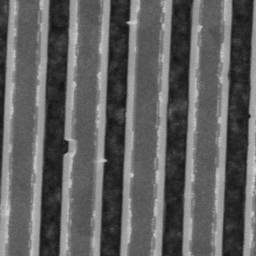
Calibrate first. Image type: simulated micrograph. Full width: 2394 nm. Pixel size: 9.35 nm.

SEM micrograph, one or a few lines or trenches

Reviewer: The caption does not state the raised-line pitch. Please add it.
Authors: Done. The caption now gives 571 nanometres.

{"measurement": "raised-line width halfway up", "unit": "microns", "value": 0.306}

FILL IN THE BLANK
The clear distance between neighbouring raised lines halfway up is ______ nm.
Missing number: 266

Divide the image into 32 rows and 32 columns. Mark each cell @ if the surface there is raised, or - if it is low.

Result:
--@@@@---@@@@----@@@@----@@@@---
--@@@@---@@@@----@@@@----@@@----
-@@@@@---@@@@----@@@@----@@@----
-@@@@@---@@@@----@@@@---@@@@----
-@@@@----@@@@----@@@@---@@@@----
-@@@@----@@@@----@@@@---@@@@----
-@@@@----@@@@----@@@@---@@@@----
-@@@@----@@@@----@@@@---@@@@----
-@@@@----@@@@----@@@@---@@@@----
-@@@@----@@@@---@@@@@---@@@@----
-@@@@----@@@@---@@@@@---@@@@----
-@@@@----@@@@---@@@@@---@@@@----
-@@@@----@@@@---@@@@----@@@@----
-@@@@----@@@@---@@@@----@@@@----
-@@@@----@@@@---@@@@----@@@@----
-@@@@----@@@@---@@@@----@@@@----
-@@@@----@@@@---@@@@----@@@@----
-@@@@----@@@@---@@@@----@@@@----
-@@@@----@@@@---@@@@----@@@@----
-@@@@----@@@@---@@@@----@@@@---@
-@@@@---@@@@----@@@@----@@@@---@
-@@@@---@@@@----@@@@----@@@@---@
-@@@@---@@@@----@@@@----@@@@---@
-@@@@---@@@@----@@@@----@@@@---@
-@@@@---@@@@----@@@@---@@@@@---@
@@@@@---@@@@----@@@@---@@@@----@
@@@@@---@@@@----@@@@---@@@@----@
-@@@@---@@@@----@@@@---@@@@----@
@@@@@---@@@@----@@@@---@@@@----@
@@@@----@@@@----@@@@---@@@@----@
@@@@----@@@@----@@@@---@@@@----@
@@@@----@@@@----@@@@---@@@@----@